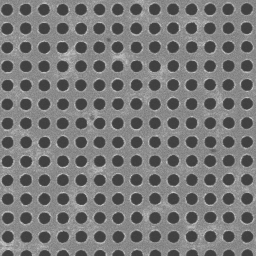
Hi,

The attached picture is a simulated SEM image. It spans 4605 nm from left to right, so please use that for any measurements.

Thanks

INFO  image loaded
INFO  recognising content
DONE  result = a regular array of holes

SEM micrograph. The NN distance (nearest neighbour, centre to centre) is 18.2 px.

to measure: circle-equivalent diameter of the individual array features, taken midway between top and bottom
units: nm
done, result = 214